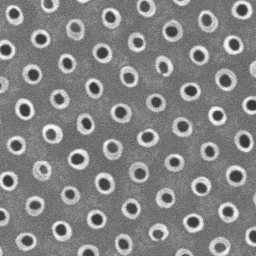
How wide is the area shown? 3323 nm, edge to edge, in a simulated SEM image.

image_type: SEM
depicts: a regular array of ring-shaped raised bodies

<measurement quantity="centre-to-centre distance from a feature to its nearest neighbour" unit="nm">452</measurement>